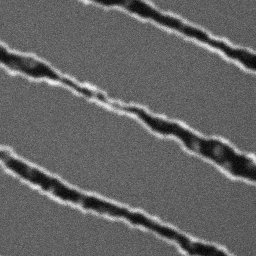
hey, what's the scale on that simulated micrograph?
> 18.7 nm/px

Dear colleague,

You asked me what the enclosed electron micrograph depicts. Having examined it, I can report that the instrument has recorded one or a few lines or trenches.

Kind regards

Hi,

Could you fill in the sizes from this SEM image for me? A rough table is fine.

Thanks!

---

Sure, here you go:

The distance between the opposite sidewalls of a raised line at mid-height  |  314 nm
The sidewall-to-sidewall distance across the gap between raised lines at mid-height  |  1490 nm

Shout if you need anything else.